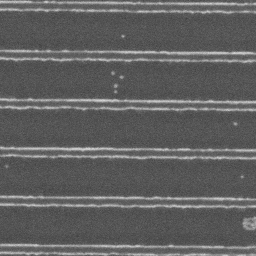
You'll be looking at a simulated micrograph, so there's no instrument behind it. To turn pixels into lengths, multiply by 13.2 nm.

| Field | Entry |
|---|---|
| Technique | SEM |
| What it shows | lines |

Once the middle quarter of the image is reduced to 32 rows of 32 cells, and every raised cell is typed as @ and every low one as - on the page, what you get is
--------------------------------
--------------------------------
--------------------------------
--------------------------------
--------------------------------
--------------------------------
--------------------------------
--------------------------------
--------------------------------
@@@@@@@@@@@@@@@@@@@@@@@@@@@@@@@@
@@@@@@@@@@@@@@@@@@@@@@@@@@@@@@@@
----------------------------@---
--------------------------------
--------------------------------
--------------------------------
--------------------------------
--------------------------------
--------------------------------
--------------------------------
--------------------------------
--------------------------------
@@@@@@@@@@@@@@@@@@@@@@@@@@--@@@-
@@@@@@@@@@@@@@@@@@@@@@@@@@@@@@@@
------------------@@---------@@@
--------------------------------
--------------------------------
--------------------------------
--------------------------------
--------------------------------
--------------------------------
--------------------------------
--------------------------------